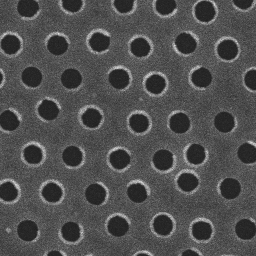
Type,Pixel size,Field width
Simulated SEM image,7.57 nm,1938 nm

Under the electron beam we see a regular array of holes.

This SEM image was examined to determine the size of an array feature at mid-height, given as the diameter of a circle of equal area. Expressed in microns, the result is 0.153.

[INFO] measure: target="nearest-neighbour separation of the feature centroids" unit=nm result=289